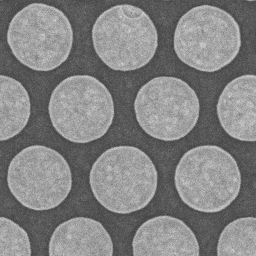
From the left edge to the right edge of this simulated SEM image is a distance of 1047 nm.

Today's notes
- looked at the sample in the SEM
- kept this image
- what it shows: a regular array of raised bodies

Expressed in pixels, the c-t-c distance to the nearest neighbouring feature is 80.5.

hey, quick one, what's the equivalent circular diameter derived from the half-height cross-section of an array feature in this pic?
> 265 nanometres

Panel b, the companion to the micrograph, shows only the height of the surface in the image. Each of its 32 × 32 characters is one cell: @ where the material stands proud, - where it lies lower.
--------------------------------
---@@@@@-----@@@-------@@@@@----
--@@@@@@----@@@@@@@---@@@@@@@---
-@@@@@@@@---@@@@@@@---@@@@@@@@--
-@@@@@@@@---@@@@@@@@--@@@@@@@@--
-@@@@@@@@---@@@@@@@@--@@@@@@@@--
--@@@@@@@---@@@@@@@---@@@@@@@@--
--@@@@@@-----@@@@@@----@@@@@@---
----@@@-------@@@-------@@@@----
----------@---------------------
@@------@@@@@-----@@@@@------@@@
@@@----@@@@@@@---@@@@@@@----@@@@
@@@@--@@@@@@@@---@@@@@@@@--@@@@@
@@@@--@@@@@@@@---@@@@@@@@--@@@@@
@@@@--@@@@@@@@---@@@@@@@@--@@@@@
@@@----@@@@@@@---@@@@@@@----@@@@
@@-----@@@@@@-----@@@@@@----@@@@
---------@@@------------------@@
----@@---------@---------@@-----
--@@@@@@-----@@@@@-----@@@@@@---
-@@@@@@@----@@@@@@@---@@@@@@@@--
-@@@@@@@@--@@@@@@@@---@@@@@@@@--
-@@@@@@@@--@@@@@@@@@--@@@@@@@@--
-@@@@@@@@--@@@@@@@@---@@@@@@@@--
--@@@@@@----@@@@@@@----@@@@@@---
---@@@@------@@@@@-----@@@@@----
---------------@----------------
@--------@@--------@@@-------@@@
@@@----@@@@@@----@@@@@@@----@@@@
@@@----@@@@@@@---@@@@@@@----@@@@
@@@@--@@@@@@@@---@@@@@@@@--@@@@@
@@@@--@@@@@@@@---@@@@@@@@--@@@@@